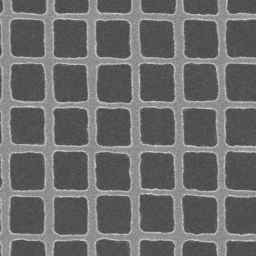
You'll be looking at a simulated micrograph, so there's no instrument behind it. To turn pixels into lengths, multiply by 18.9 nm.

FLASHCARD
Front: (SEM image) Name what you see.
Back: a regular array of holes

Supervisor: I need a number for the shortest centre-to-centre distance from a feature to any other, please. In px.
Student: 42.3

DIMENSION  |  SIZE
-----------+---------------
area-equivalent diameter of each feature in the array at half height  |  740 nanometres